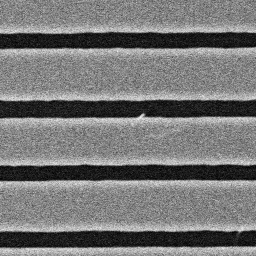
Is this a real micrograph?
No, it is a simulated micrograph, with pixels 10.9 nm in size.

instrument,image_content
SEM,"lines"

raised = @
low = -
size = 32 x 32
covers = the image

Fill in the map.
@@@@@@@@@@@@@@@@@@@@@@@@@@@@@@@@
@@@@@@@@@@@@@@@@@@@@@@@@@@@@@@@@
@@@@@@@@@@@@@@@@@@@@@@@@@@@@@@@@
@@@@@@@@@@@@@@@@@@@@@@@@@@@@@@@@
--------------------------------
--------------------------------
@@@@@@@@@@@@@@@@@@@@@@@@@@@@@@@@
@@@@@@@@@@@@@@@@@@@@@@@@@@@@@@@@
@@@@@@@@@@@@@@@@@@@@@@@@@@@@@@@@
@@@@@@@@@@@@@@@@@@@@@@@@@@@@@@@@
@@@@@@@@@@@@@@@@@@@@@@@@@@@@@@@@
@@@@@@@@@@@@@@@@@@@@@@@@@@@@@@@@
@@@@@@@-@-@@@@@@@@@------@-@@@@-
--------------------------------
--------------------------------
@@@@@@@@@@@@@@@@@@@@@@@@@@@@@@@@
@@@@@@@@@@@@@@@@@@@@@@@@@@@@@@@@
@@@@@@@@@@@@@@@@@@@@@@@@@@@@@@@@
@@@@@@@@@@@@@@@@@@@@@@@@@@@@@@@@
@@@@@@@@@@@@@@@@@@@@@@@@@@@@@@@@
@@@@@@@@@@-@@@@@@@@-@@@--@@@-@@@
--------------------------------
------------------@-------------
@@@@@@@@@@@@@@@@@@@@@@@@@@@@@@@@
@@@@@@@@@@@@@@@@@@@@@@@@@@@@@@@@
@@@@@@@@@@@@@@@@@@@@@@@@@@@@@@@@
@@@@@@@@@@@@@@@@@@@@@@@@@@@@@@@@
@@@@@@@@@@@@@@@@@@@@@@@@@@@@@@@@
@@@@@@@@@@@@@@@@@@@@@@@@@@@@@@@@
--------------------------------
--------------------------------
@@@@@@@@@@@@@@@@@@@@@@@@@@@@@@@@